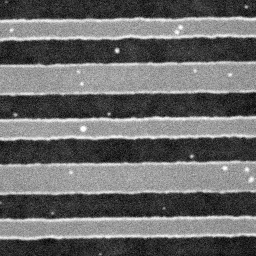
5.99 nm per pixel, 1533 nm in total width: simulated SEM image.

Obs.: lines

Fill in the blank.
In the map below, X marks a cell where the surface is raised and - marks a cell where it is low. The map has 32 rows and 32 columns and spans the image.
--------------------------------
--------------------------------
-XXXXXX-XXXXXXXXXXXXXXXXXXXXXXXX
XXXXXXXXXXXXXXXXXXXXXXXXXXXXXXXX
XXXXXXXXXXXXXXXXXXXXXXXXXXXXXXXX
--------------------------------
--------------------------------
--------------------------------
XXXXXXXXXXXXXXXXXXXXXXXXXXXXXXXX
XXXXXXXXXXXXXXXXXXXXXXXXXXXXXXXX
XXXXXXXXXXXXXXXXXXXXXXXXXXXXXXXX
XXXXXXXXXXXXXXXXXXXXXXXXX-XXX---
--------------------------------
--------------------------------
--------------------------------
XXXXXXXXXXXXXXXXXXXXXXXXXXXXXXXX
XXXXXXXXXXXXXXXXXXXXXXXXXXXXXXXX
XX------------------------------
--------------------------------
--------------------------------
----X-XXXXXXXXXXXXXXXXXXXXXXXXXX
XXXXXXXXXXXXXXXXXXXXXXXXXXXXXXXX
XXXXXXXXXXXXXXXXXXXXXXXXXXXXXXXX
XXXXXXXXXXXXXXXXXXXXXXXXXXXXXXXX
--------------------------------
--------------------------------
--------------------------------
XXXXXXXXXXXXXXXXXXXXXXXXXXXXXXXX
XXXXXXXXXXXXXXXXXXXXXXXXXXXXXXXX
XXXXXXXXXXXXXXXXXXXXXXXXX---X---
--------------------------------
--------------------------------